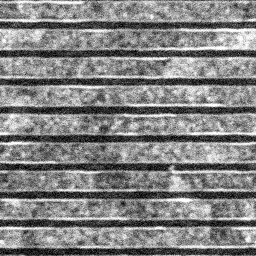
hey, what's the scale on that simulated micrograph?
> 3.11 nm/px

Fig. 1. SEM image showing parallel lines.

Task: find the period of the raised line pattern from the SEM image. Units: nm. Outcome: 88.1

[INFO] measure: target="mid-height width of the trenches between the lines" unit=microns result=0.0253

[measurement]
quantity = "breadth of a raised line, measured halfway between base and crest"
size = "62.7 nanometres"